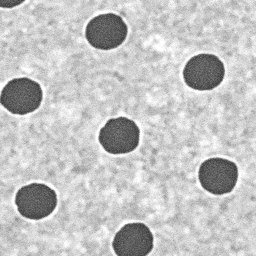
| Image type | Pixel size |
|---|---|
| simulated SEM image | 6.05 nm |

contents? holes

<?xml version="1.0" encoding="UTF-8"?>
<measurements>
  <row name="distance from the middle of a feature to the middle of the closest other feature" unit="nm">637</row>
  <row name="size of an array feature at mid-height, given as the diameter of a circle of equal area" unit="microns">0.248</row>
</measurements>